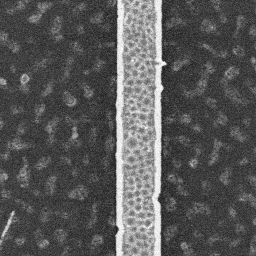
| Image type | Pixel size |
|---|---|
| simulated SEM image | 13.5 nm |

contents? one or a few lines or trenches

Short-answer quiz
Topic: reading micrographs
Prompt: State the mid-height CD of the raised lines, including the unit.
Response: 38.3 px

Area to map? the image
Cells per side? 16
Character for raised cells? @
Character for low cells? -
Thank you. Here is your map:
--------@@------
--------@@------
--------@@------
--------@@------
--------@@------
--------@@------
--------@@------
--------@@------
-------@@@------
-------@@@------
-------@@@------
-------@@@------
-------@@@------
-------@@@------
--------@@------
-------@@@------